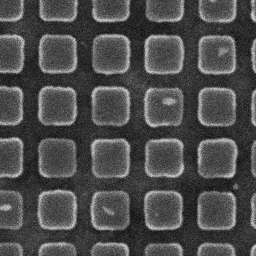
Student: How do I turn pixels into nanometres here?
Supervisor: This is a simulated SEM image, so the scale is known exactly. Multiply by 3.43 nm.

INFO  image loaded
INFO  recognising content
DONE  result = a regular array of raised bodies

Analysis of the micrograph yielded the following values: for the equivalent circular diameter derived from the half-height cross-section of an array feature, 143 nm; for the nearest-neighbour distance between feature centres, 178 nm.